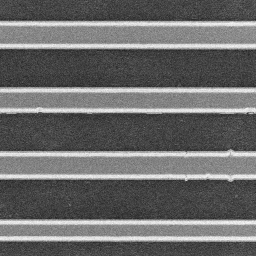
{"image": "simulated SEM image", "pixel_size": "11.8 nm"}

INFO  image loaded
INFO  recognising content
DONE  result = one or a few lines or trenches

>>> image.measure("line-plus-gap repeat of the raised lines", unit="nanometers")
770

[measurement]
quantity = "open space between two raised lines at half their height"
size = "525 nanometers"